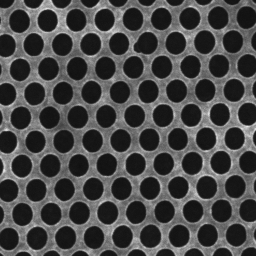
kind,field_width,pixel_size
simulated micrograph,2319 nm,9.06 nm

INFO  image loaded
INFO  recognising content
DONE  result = a regular array of holes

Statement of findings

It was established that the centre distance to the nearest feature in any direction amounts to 0.251 micrometres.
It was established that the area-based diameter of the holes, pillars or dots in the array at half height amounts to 0.198 micrometres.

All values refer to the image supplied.